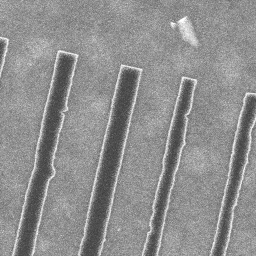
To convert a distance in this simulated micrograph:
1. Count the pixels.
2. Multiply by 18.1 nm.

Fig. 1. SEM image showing one or a few lines or trenches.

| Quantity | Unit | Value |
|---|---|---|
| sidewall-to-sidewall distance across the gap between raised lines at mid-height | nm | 808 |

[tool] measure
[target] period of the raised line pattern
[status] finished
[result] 1140 nanometres